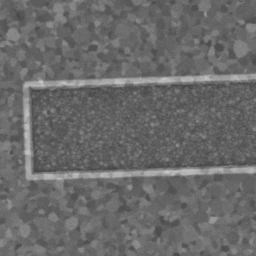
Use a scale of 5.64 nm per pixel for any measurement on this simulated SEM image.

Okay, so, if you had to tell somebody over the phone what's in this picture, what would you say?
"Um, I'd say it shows one or a few lines or trenches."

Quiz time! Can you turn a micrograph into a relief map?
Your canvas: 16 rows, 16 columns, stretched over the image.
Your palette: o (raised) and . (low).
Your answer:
oooooooooooooooo
oooooooooooooooo
oooooooooooooooo
oooooooooooooooo
oooooooooooooooo
oo..............
oo..............
oo..............
oo..............
oo..............
oo..............
oooooooooooooooo
oooooooooooooooo
oooooooooooooooo
oooooooooooooooo
oooooooooooooooo